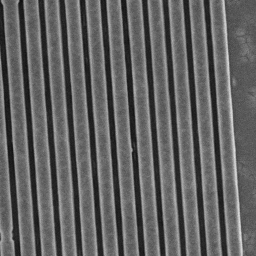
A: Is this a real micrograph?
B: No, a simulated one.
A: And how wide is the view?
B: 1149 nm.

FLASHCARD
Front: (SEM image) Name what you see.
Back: parallel lines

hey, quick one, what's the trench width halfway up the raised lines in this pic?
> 0.0269 microns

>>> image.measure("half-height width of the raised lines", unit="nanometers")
64.9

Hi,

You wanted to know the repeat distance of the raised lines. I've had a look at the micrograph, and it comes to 20.6 px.